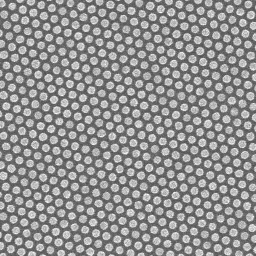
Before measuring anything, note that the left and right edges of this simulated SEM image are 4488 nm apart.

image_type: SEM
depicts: a regular array of raised bodies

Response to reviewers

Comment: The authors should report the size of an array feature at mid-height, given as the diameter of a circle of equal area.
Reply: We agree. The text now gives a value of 136 nm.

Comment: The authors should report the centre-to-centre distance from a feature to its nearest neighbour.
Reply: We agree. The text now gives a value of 0.19 µm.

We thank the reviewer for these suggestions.